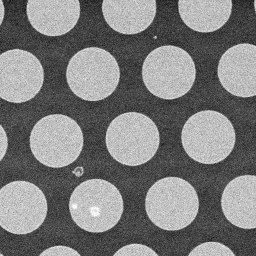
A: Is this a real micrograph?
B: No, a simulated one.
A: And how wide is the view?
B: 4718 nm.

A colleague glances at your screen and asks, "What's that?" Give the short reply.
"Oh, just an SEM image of an array of small figures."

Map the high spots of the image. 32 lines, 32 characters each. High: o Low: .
...ooooooo...oooooo...ooooooo...
...ooooooo...oooooo...ooooooo...
....oooooo...oooooo....ooooo....
....ooooo.....oooo......ooo.....
................................
................................
.oo.......ooo......oooo.....oooo
ooooo....ooooo....oooooo....oooo
ooooo...ooooooo...oooooo...ooooo
ooooo...ooooooo...oooooo...ooooo
ooooo....oooooo...oooooo....oooo
ooooo....ooooo.....oooo......ooo
.ooo.......o....................
................................
......oo.......ooo......oooo....
.....ooooo....ooooo....oooooo...
o...oooooo...ooooooo...oooooo...
o...oooooo...ooooooo...oooooo...
o...oooooo....oooooo...oooooo...
....oooooo....ooooo.....oooo....
.....oooo......oo...............
................................
...........oo.......ooo......ooo
ooooo.....oooo.....ooooo....oooo
ooooo....oooooo...ooooooo...oooo
oooooo...oooooo...ooooooo...oooo
oooooo...oooooo...ooooooo...oooo
ooooo....oooooo....ooooo.....ooo
ooooo.....oooo......ooo.........
................................
.........................ooo....
.....ooooo.....oooo.....ooooo...